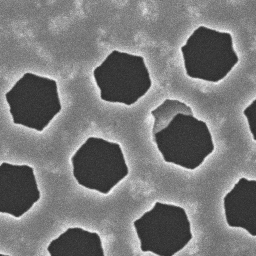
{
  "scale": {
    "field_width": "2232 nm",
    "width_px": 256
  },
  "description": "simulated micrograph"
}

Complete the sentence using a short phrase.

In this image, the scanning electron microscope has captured holes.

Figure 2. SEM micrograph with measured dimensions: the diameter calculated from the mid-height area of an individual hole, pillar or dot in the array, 475 nm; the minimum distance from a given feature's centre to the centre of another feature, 0.775 micrometres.